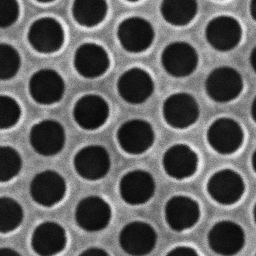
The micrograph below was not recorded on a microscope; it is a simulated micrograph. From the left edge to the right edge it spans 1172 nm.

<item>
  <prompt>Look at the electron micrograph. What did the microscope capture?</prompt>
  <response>a regular array of holes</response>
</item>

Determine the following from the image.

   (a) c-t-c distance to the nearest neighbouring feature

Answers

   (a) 232 nm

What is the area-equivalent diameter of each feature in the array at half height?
167 nanometers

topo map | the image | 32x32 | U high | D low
DDUUUUUUUDDDDUUUUUUUDDDDDUUUUUUD
DDUUUUUUUDDDDUUUUUUUDDDDDUUUUUUD
DDUUUDDUUDDDDUUDDDUUUDDDUUDDDDUU
UUUUDDDDUUUUUUUDDDDUUUUUUUDDDDUU
UUUDDDDDUUUUUUUDDDDUUUUUUUDDDDUU
DUUUDDDDUUDDUUUDDDDUUDDDUUDDDDUU
DDUUUDDUUDDDDUUUDDUUDDDDDUUUUUUD
DDDUUUUUUDDDDDUUUUUUDDDDDUUUUUUD
DDUUUUUUUDDDDDUUUUUUDDDDDUUDDUUU
DDUUDDDDUUDDDUUDDDDUUUDUUUDDDDUU
UUUUDDDDUUUUUUUDDDDUUUUUUUDDDDUU
UUUUDDDDUUUUUUUDDDDUUUUUUUDDDDUU
DDUUDDDUUUDDDUUUDDUUUDDDUUUDDUUU
DDDUUUUUUDDDDDUUUUUUDDDDDUUUUUUD
DDDUUUUUUDDDDDUUUUUUDDDDDUUUUUUD
DDUUDDDDUUDDDUUDDDDUUDDDUUDDDDUU
UUUUDDDDUUUUUUUDDDDUUUUUUUDDDDUU
UUUUDDDDUUUUUUUDDDDUUUUUUUDDDDUU
DDUUDDDDUUDDDUUDDDDUUDDDUUUDDDUU
DDDUUUUUUDDDDDUUUUUUDDDDDUUUUUUU
DDDUUUUUUDDDDDUUUUUUDDDDDUUUUUUD
DDUUUDDUUUDDDDUUDDUUUDDDUUUDDDUU
DUUUDDDDUUUDUUUDDDDUUUUUUUDDDDUU
UUUUDDDDUUUUUUUDDDDUUUUUUUDDDDDU
UUUUDDDDUUUDUUUDDDDUUUDUUUDDDDUU
DDUUUDDUUUDDDDUUDDUUUDDDDUUUDUUU
DDDUUUUUUDDDDDUUUUUUUDDDDUUUUUUU
DDDUUUUUUDDDDDUUUUUUUDDDDUUUUUUU
DDUUDDDDUUDDDUUDDDDUUDDDUUDDDDUU
UUUUDDDDUUUUUUUDDDDDUUUUUUDDDDDU
UUUUDDDDUUUUUUUDDDDUUUUUUUDDDDDU
DDUUDDDDUUDDDUUUDDDUUDDDDUUDDDUU